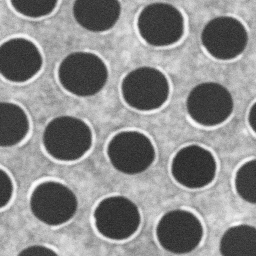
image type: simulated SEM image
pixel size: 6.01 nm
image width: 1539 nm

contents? a regular array of holes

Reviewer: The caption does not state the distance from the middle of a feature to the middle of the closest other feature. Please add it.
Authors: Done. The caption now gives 388 nanometers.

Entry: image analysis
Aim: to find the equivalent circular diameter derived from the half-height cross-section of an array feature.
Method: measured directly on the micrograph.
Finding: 280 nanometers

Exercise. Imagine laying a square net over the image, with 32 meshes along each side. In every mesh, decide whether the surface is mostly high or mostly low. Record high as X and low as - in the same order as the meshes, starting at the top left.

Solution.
X------XX------XXXX--XXXXXXXXXXX
XX----XXX------XXX-----XXXXXXXXX
XXXXXXXXX------XX------XXX----XX
XXXXXXXXXX----XXX------XX------X
XXXXXXXXXXXXXXXXXX-----XX------X
----XXXXXXXXXXXXXXX---XXX------X
-----XXXX--XXXXXXXXXXXXXXX----XX
-----XXX-----XXXXXXXXXXXXXX--XXX
-----XX------XXXX--XXXXXXXXXXXXX
----XXX-------XX-----XXXXXXXXXXX
XXXXXXXX-----XX------XXXX---XXXX
XXXXXXXXX---XXX------XXX-----XXX
XXXXXXXXXXXXXXX------XX------XXX
---XXXXXXXXXXXXXX---XXX------XX-
---XXXXX-XXXXXXXXXXXXXXX-----XX-
----XX-----XXXXXXXXXXXXXX---XXX-
----X------XXXX--XXXXXXXXXXXXXXX
---XX-------XX-----XXXXXXXXXXXXX
XXXXXX-----XX------XXXX--XXXXXXX
XXXXXX----XXX------XXX-----XXXXX
XXXXXXXXXXXXXX-----XX------XXX--
-XXXXXXXXXXXXXX---XXX------XXX--
-XXXXXXXXXXXXXXXXXXXXX-----XX---
--XX-----XXXXXXXXXXXXXX--XXXX---
-XXX------XXXX-XXXXXXXXXXXXXXX--
-XXX------XX-----XXXXXXXXXXXXXXX
XXXX------XX-----XXXX---XXXXXXXX
XXXXX----XXX------XX-----XXXXXXX
XXXXXXXXXXXX-----XXX-----XXXX---
XXXXXXXXXXXXX---XXXX-----XXX----
XXXXXXXXXXXXXXXXXXXX-----XX-----
XX-----XXXXXXXXXXXXXX---XXX-----